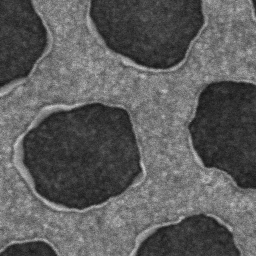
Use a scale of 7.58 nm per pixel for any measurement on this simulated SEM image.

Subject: holes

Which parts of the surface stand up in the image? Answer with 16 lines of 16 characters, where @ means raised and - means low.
--@@@@-------@@@
---@@@-------@@@
---@@@------@@@@
---@@@@@----@@@@
--@@@@@@@@@@@@@@
@@@@@@@@@@@@@---
@@@@@--@@@@@----
@@------@@@@----
@@------@@@@----
@--------@@@----
@@-------@@@@---
@@------@@@@@@@-
@@@----@@@@@@@@@
@@@@@@@@@@@@-@@@
@@@@@@@@@@----@@
---@@@@@@------@